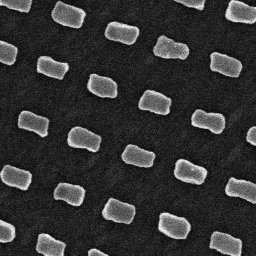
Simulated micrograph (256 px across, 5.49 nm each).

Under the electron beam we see a regular array of raised bodies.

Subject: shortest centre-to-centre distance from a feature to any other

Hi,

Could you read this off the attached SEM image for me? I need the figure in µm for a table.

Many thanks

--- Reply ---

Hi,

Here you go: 0.298